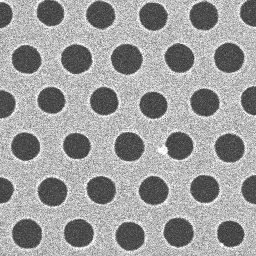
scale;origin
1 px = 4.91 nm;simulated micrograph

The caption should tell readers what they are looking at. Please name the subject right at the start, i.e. a regular array of holes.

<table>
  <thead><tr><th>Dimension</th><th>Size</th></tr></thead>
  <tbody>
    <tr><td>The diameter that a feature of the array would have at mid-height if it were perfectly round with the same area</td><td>0.142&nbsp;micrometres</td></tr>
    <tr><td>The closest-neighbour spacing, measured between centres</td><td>238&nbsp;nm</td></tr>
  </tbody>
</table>